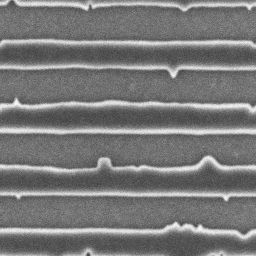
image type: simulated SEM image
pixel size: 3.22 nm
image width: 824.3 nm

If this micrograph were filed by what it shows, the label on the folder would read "one or a few lines or trenches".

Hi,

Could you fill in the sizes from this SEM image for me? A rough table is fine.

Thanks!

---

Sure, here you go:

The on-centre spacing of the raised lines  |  0.203 microns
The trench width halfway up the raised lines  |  113 nanometers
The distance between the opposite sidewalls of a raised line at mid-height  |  90.2 nanometres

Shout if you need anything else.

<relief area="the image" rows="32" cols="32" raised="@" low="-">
@-@@@@@@@@@@@@@@@@@@@@@@@@@@@@@@
--------------------------------
--------------------------------
--------------------------------
--------------------------------
@@@@@@@@@@@@@@@@@@@@@@@@@@@@@@@@
@@@@@@@@@@@@@@@@@@@@@@@@@@@@@@@@
@@@@@@@@@@@@@@@@@@@@@@@@@@@@@@@@
--@@@------------@@@@@@--@@@@@@@
--------------------------------
--------------------------------
--------------------------------
--------------------------------
@@@@@@@@@@@@@@@@@@@@@@@@@@@@@@@@
@@@@@@@@@@@@@@@@@@@@@@@@@@@@@@@@
@@@@@@@@@@@@@@@@@@@@@@@@@@@@@@@@
-------@@@--------------@@@@@@-@
--------------------------------
--------------------------------
--------------------------------
------------@@-----------@@-----
@@@@@@@@@@@@@@@@@@@@@@@@@@@@@@@@
@@@@@@@@@@@@@@@@@@@@@@@@@@@@@@@@
@@@@@@@@@@@@@@@@@@@@@@@@@@@@@@@@
--@------------------------@@---
--------------------------------
--------------------------------
--------------------------------
---------------------@@@--------
@@@@@@@@@@@@@@@@@@@@@@@@@@@@@@@@
@@@@@@@@@@@@@@@@@@@@@@@@@@@@@@@@
@@@@@@@@@@@@@@@@@@@@@@@@@@@@@@@@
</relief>